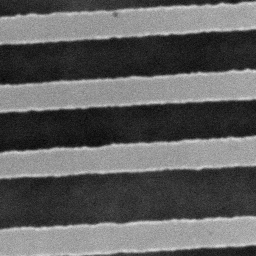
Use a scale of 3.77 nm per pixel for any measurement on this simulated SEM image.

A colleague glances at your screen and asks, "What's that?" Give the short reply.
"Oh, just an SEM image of lines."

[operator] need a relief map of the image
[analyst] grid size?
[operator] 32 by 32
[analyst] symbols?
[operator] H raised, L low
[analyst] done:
LLLLLLLLLLLLLLLLLLLLLLLLLLLHLLHH
LLLLLLLLLLLLHHHHHHHHHHHHHHHHHHHH
HHHHHHHHHHHHHHHHHHHHHHHHHHHHHHHH
HHHHHHHHHHHHHHHHHHHHHHHHHHHHHHHH
HHHHHHHHHHHHHHHHHHLLLLLLLLLLLLLL
HHLLLLLLLLLLLLLLLLLLLLLLLLLLLLLL
LLLLLLLLLLLLLLLLLLLLLLLLLLLLLLLL
LLLLLLLLLLLLLLLLLLLLLLLLLLLLLLLL
LLLLLLLLLLLLLLLLLLLLLLLLLLLLLLLL
LLLLLLLLLLLLLLLLLLLLHHHHHHHHHHHH
LLLLLHHHHHHHHHHHHHHHHHHHHHHHHHHH
HHHHHHHHHHHHHHHHHHHHHHHHHHHHHHHH
HHHHHHHHHHHHHHHHHHHHHHHHHHHHHLLL
HHHHHHHHHHHLLLLLLLLLLLLLLLLLLLLL
LLLLLLLLLLLLLLLLLLLLLLLLLLLLLLLL
LLLLLLLLLLLLLLLLLLLLLLLLLLLLLLLL
LLLLLLLLLLLLLLLLLLLLLLLLLLLLLLLL
LLLLLLLLLLLLLLLLLLLLLLLLHLHHHHHH
LLLLLLLLLLHLHHHHHHHHHHHHHHHHHHHH
HHHHHHHHHHHHHHHHHHHHHHHHHHHHHHHH
HHHHHHHHHHHHHHHHHHHHHHHHHHHHHHHH
HHHHHHHHHHHHHHHHLLLLLLLLLLLLLLLL
LLLLLLLLLLLLLLLLLLLLLLLLLLLLLLLL
LLLLLLLLLLLLLLLLLLLLLLLLLLLLLLLL
LLLLLLLLLLLLLLLLLLLLLLLLLLLLLLLL
LLLLLLLLLLLLLLLLLLLLLLLLLLLLLLLL
LLLLLLLLLLLLLLLLLLLLLLLLLLLLLLLL
LLLLLLLLLLLLLLLLLLLLLHHHHHHHHHHH
LLHHHHHHHHHHHHHHHHHHHHHHHHHHHHHH
HHHHHHHHHHHHHHHHHHHHHHHHHHHHHHHH
HHHHHHHHHHHHHHHHHHHHHHHHHHHHHHHH
HHHHHHHHHHHHHHHLLLLLLLLLLLLLLLLL